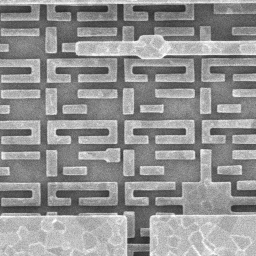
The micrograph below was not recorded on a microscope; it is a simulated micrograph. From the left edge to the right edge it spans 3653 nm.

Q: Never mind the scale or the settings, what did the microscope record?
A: wiring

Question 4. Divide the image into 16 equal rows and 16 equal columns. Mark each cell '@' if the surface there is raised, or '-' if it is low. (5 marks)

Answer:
----------------
----------------
--------@@------
--------@@------
----------------
----------------
----------------
----------------
----------------
----------------
----------------
----------------
----------------
----------@@@@@@
@@@@@@@@-@@@@@@@
@@@@@@@@-@@@@@@@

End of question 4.